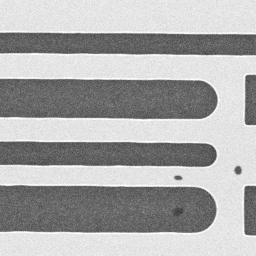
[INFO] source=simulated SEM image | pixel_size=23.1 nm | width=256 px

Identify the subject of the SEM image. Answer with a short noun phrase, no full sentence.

groups of lines, slits or small figures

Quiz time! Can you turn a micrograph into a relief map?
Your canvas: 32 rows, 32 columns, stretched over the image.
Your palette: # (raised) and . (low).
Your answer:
################################
################################
################################
################################
................................
................................
................................
################################
################################
###############################.
..........................#####.
...........................####.
...........................####.
...........................###..
..........................####..
###############################.
################################
################################
...........................#####
...........................#####
...........................#####
################################
################################
.........................######.
...........................###..
...........................###..
...........................###..
...........................###..
..........................####..
################################
################################
################################